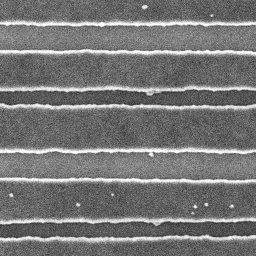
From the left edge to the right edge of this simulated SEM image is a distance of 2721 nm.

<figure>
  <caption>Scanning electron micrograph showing lines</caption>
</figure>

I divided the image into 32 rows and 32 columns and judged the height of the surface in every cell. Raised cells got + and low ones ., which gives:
++++++++++++++++++++++++++++++++
++++++++++++++++++++++++++++++++
++++++++++++++++++++++++++++++++
................................
................................
................................
++++++++++++++++++++++++++++++++
++++++++++++++++++++++++++++++++
++++++++++++++++++++++++++++++++
++++++++++++++++++++++++++++++++
++++++++++++++++++++++++++++++++
..................+.............
................................
++++++++++++++++++++++++++++++++
++++++++++++++++++++++++++++++++
++++++++++++++++++++++++++++++++
++++++++++++++++++++++++++++++++
++++++++++++++++++++++++++++++++
++++++++++++++++++++++++++++++++
................................
................................
................................
++++++++++++++++++.+..+.........
++++++++++++++++++++++++++++++++
++++++++++++++++++++++++++++++++
++++++++++++++++++++++++++++++++
++++++++++++++++++++++++++++++++
++++++++++++++++++++++++++++++++
................................
.......................+.+.....+
++++++++++++++++++++++++++++++++
++++++++++++++++++++++++++++++++